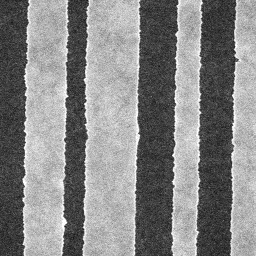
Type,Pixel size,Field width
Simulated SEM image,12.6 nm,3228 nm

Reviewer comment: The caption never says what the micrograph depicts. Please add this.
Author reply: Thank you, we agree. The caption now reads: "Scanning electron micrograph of one or a few lines or trenches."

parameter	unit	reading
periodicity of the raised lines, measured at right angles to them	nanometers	891